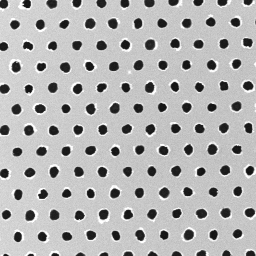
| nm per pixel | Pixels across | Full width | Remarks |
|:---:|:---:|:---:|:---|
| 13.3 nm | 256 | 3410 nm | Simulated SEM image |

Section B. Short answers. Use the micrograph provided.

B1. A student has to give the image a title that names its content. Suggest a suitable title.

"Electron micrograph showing a regular array of holes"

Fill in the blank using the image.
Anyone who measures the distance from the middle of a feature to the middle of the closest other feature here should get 316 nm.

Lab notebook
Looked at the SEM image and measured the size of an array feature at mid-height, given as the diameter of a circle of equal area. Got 127 nanometres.